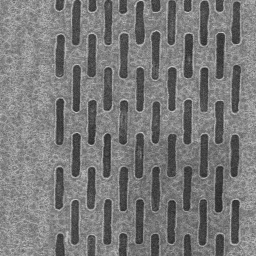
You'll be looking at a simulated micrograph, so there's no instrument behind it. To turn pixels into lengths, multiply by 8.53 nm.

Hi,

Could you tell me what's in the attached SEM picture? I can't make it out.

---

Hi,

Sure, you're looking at a regular array of holes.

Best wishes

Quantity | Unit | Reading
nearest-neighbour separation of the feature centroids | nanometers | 271